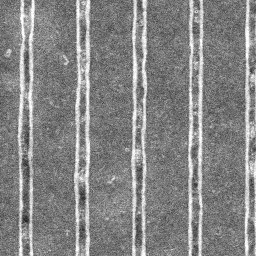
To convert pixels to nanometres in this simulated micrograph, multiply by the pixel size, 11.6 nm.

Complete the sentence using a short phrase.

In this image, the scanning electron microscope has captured parallel lines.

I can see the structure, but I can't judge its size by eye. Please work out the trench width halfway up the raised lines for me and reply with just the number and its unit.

542 nm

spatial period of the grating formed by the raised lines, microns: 0.654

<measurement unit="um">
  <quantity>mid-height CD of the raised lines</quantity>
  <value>0.113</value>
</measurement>